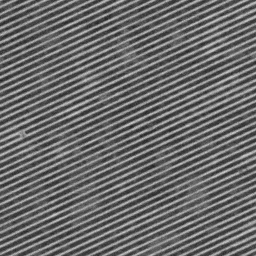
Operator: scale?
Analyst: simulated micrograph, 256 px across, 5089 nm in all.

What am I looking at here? parallel lines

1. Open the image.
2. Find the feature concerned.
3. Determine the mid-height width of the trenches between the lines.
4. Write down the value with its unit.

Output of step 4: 104 nanometres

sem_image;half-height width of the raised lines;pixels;1.02